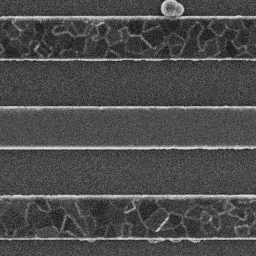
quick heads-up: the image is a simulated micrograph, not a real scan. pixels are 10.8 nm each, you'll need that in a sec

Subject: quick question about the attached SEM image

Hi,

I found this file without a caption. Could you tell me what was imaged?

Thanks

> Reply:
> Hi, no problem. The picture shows lines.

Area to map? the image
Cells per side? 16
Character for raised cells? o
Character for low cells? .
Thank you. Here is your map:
..........o.....
oooooooooooooooo
oooooooooooooooo
oooooooooooooooo
................
................
................
oooooooooooooooo
oooooooooooooooo
................
................
................
oooooooooooooooo
oooooooooooooooo
oooooooooooooooo
................